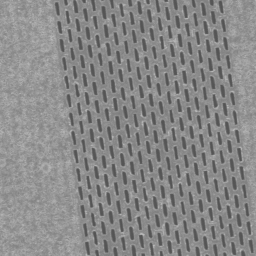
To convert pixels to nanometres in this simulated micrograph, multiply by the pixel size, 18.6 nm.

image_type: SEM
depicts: a regular array of holes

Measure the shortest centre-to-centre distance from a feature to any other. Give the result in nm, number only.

234